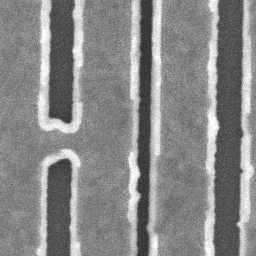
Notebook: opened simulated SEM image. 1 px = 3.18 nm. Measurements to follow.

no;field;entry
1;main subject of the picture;one or a few lines or trenches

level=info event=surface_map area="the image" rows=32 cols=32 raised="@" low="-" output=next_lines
@@@@@@----@@@@@@@--@@@@@@@@----@
@@@@@@----@@@@@@@--@@@@@@@@----@
@@@@@@----@@@@@@@--@@@@@@@@----@
@@@@@@----@@@@@@@--@@@@@@@@----@
@@@@@@----@@@@@@@--@@@@@@@@----@
@@@@@@---@@@@@@@@--@@@@@@@@----@
@@@@@@---@@@@@@@@--@@@@@@@@----@
@@@@@@---@@@@@@@@--@@@@@@@@----@
@@@@@@----@@@@@@@--@@@@@@@@----@
@@@@@@----@@@@@@@--@@@@@@@@----@
@@@@@@----@@@@@@@--@@@@@@@@----@
@@@@@@---@@@@@@@@--@@@@@@@@----@
@@@@@@---@@@@@@@@--@@@@@@@@----@
@@@@@@---@@@@@@@@--@@@@@@@@----@
@@@@@@---@@@@@@@@--@@@@@@@@----@
@@@@@@@@-@@@@@@@@--@@@@@@@@----@
@@@@@@@@@@@@@@@@@--@@@@@@@@----@
@@@@@@@@@@@@@@@@@--@@@@@@@@---@@
@@@@@@@@@@@@@@@@@--@@@@@@@@---@@
@@@@@@@@@@@@@@@@@--@@@@@@@@---@@
@@@@@@---@@@@@@@@--@@@@@@@----@@
@@@@@@---@@@@@@@@--@@@@@@@@----@
@@@@@@---@@@@@@@@--@@@@@@@@---@@
@@@@@@---@@@@@@@@--@@@@@@@----@@
@@@@@@---@@@@@@@@--@@@@@@@----@@
@@@@@@---@@@@@@@@--@@@@@@@@---@@
@@@@@@---@@@@@@@@--@@@@@@@@---@@
@@@@@----@@@@@@@@--@@@@@@@@---@@
@@@@@----@@@@@@@@--@@@@@@@----@@
@@@@@----@@@@@@@@--@@@@@@@----@@
@@@@@----@@@@@@@@--@@@@@@@@---@@
@@@@@----@@@@@@@@--@@@@@@@@---@@